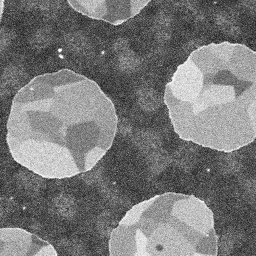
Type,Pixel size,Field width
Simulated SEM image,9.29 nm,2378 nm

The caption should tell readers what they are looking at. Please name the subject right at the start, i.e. raised bodies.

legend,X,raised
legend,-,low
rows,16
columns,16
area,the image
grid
-----XXXX-------
----------------
----------------
------------XXXX
----X------XXXXX
-XXXXX----XXXXXX
-XXXXXX---XXXXXX
-XXXXXX----XXXXX
XXXXXXX----XXXXX
-XXXXXX---------
--XXXX----------
----------------
---------XXX----
--------XXXXX---
XX-----XXXXXX---
XXX----XXXXXXX--